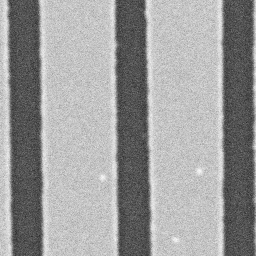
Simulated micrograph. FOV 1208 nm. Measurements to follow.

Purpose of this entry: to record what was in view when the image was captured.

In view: lines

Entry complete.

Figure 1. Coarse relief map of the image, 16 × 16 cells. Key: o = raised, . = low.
...oooo..ooooo..
...oooo..ooooo..
...oooo..ooooo..
...oooo..ooooo..
o..oooo..ooooo..
o..oooo..ooooo..
o..oooo..ooooo..
o..oooo..ooooo..
o..oooo..ooooo..
o..oooo..ooooo..
o..oooo..ooooo..
o..oooo..ooooo..
o..oooo..ooooo..
o..oooo..ooooo..
o..oooo..ooooo..
o..oooo...oooo..